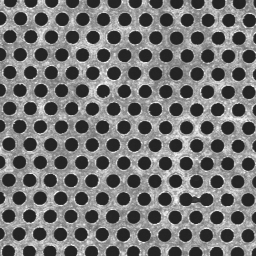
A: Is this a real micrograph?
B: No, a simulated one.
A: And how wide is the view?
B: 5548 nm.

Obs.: a regular array of holes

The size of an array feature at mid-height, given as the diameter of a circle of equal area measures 292 nanometres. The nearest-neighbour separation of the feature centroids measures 0.445 µm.